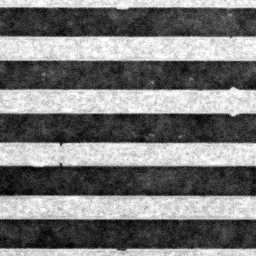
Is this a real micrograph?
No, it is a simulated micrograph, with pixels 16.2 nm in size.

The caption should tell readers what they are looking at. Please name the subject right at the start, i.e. parallel lines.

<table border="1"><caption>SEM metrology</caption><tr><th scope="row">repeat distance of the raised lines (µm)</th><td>0.86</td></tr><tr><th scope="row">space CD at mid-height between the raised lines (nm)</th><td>491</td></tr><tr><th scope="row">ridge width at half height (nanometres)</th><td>363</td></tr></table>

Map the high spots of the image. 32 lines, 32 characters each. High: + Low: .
++++++++++++++++++++++++++++++++
................................
................................
................................
................................
++++++++++++++++++++++++++++++++
++++++++++++++++++++++++++++++++
................................
................................
................................
................................
++++++++++++++++++.+++++++++++++
++++++++++++++++++++++++++++++++
++++++++++++++++.+++++++++++++++
................................
................................
................................
................................
++++++++++++++++++++++++++++++++
++++++++++++++++++++++++++++++++
++++.+++++++++++++++++++++++++++
................................
................................
................................
................................
++++++++++++++++++++++++++++++++
++++++++++++++++++++++++++++++++
................................
................................
................................
................................
++++++++++++++++++++++++++++++++